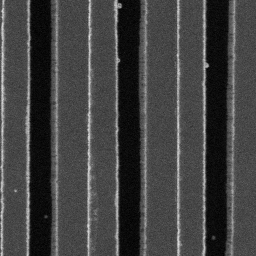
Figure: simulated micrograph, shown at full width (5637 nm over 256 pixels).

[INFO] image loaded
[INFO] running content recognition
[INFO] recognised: lines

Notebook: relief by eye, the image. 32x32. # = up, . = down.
####...########...########...###
####...########...########...###
####...########...########...###
####...#######....########...###
####...########...########...###
####...########...########...###
####...########...########...###
####...########...########...###
####...########...########...###
####...########...########...###
####...########...########...###
####...########...########...###
####...########...########...###
####...########...########...###
####...########...########...###
####...########...########...###
####...########...########...###
####...########...########...###
####...########...########...###
####...########...########...###
####...########...########...###
####...########...########...###
####...########...########...###
####...########...########...###
####...########...########...###
####...########...########...###
####...########...########...###
####...########...########...###
####...########...########...###
####...########...########...###
####...########...########...###
####...########...########...###